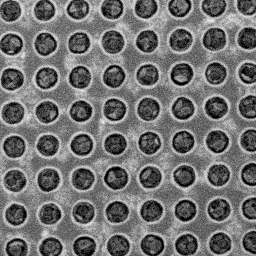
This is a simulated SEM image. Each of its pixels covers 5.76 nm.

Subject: a regular array of holes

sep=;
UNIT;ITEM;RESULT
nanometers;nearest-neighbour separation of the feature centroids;194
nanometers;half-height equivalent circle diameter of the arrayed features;134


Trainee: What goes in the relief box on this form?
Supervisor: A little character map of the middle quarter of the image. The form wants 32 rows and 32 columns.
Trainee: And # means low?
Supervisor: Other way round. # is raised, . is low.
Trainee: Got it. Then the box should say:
####.######...#####....####.....
##....####.....###.....####.....
#......###.....###......##......
#......###.....###......###.....
#......###.....####....####....#
##....#####...######..#######.##
################################
################################
############.#######..######...#
###...####.....####....####.....
##.....###......##......###.....
#......###......##......###.....
#......###.....###......###.....
##.....####....####....#####...#
###..###########################
################################
################################
###...######..######...#####....
##.....####....####.....###.....
##.....###......##......###.....
##.....###......##......###.....
##.....###.....####.....####....
###...######..#######.##########
################################
################################
#####################.#######..#
###....####....#####....####....
##.....###......###.....###.....
##......##......##......###.....
##......##......###.....####....
##.....####....#####....#####...
####..######.###################